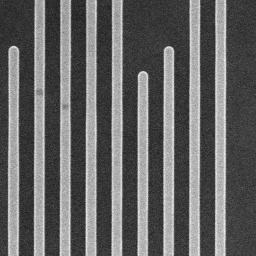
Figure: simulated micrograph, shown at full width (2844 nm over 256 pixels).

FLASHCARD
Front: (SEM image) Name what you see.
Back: groups of lines, slits or small figures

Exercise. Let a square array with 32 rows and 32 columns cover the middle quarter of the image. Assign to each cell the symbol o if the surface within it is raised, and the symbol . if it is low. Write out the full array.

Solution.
oo....oo....ooo..........oo.....
oo....oo....ooo..........oo.....
oo....oo....ooo....oo....oo.....
o.....oo....ooo....oo....oo.....
o.....oo....oo.....oo....oo.....
o.....oo....oo.....oo....oo.....
o.....oo....oo.....oo....oo....o
o.....oo....oo.....oo....oo....o
o.....oo....oo.....oo....oo....o
o.....oo....oo.....oo....oo....o
o.....oo....ooo...ooo....oo....o
o.....oo....ooo...ooo....oo....o
o.....oo....ooo...ooo....oo....o
o.....oo....ooo...ooo....oo....o
o.....oo....ooo...ooo....oo....o
o.....oo....ooo...ooo....oo....o
o.....oo....ooo...ooo....oo....o
oo....oo....ooo...ooo....oo....o
oo....oo....ooo...ooo....oo....o
oo....oo....ooo...ooo....oo....o
oo....oo....ooo...ooo....oo....o
o.....oo....oo....ooo....oo....o
o.....oo....oo....ooo....oo....o
o.....oo....oo....ooo....oo....o
o.....oo....oo....ooo....oo....o
o.....oo....oo....ooo....oo....o
o.....oo....oo....ooo....oo....o
o.....oo....oo....ooo....oo....o
o.....oo....oo....ooo....oo....o
o.....oo....oo....ooo....oo....o
o.....oo....oo....ooo....oo....o
o.....oo....oo....ooo....oo....o